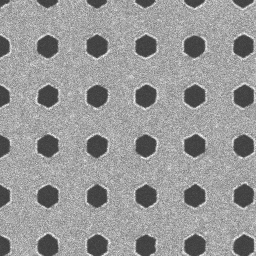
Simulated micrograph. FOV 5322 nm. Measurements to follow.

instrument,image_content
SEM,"a regular array of holes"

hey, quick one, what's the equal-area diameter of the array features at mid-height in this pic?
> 467 nm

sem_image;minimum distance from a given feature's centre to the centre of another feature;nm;1010